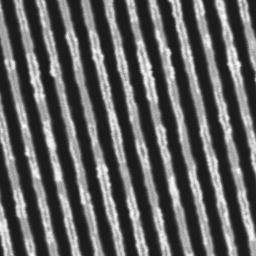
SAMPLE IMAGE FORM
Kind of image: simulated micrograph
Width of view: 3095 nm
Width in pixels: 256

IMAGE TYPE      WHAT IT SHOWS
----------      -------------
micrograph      parallel lines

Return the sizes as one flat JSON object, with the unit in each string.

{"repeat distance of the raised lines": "264 nanometres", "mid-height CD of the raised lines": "119 nm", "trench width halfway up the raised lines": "141 nm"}